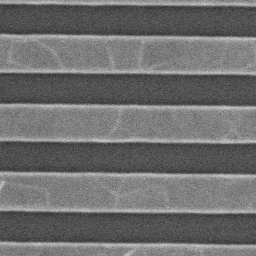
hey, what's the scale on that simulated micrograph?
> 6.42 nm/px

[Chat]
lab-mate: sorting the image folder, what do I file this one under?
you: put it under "wiring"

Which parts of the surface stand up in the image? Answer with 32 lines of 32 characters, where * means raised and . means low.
...........**....***************
................................
................................
................................
************....................
********************************
********************************
********************************
********************************
................................
................................
................................
................................
********************************
********************************
********************************
********************************
********************************
................................
................................
................................
................................
********************************
********************************
********************************
********************************
........................********
................................
................................
................................
**************..................
********************************